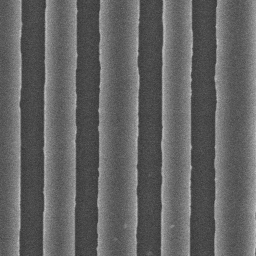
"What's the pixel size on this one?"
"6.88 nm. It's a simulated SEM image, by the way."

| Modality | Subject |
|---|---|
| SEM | lines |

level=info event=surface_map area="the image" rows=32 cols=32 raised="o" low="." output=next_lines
ooo...ooo....oooo...oooo...ooooo
ooo...oooo..ooooo...oooo...ooooo
ooo...ooo...ooooo...oooo...ooooo
ooo...ooo...ooooo...oooo...ooooo
ooo...ooo...ooooo...oooo...ooooo
oo....ooo...ooooo...oooo...ooooo
ooo...oooo..ooooo...oooo...ooooo
ooo...ooo...ooooo...oooo...ooooo
ooo...ooo....oooo...oooo...ooooo
ooo...ooo....oooo...oooo...ooooo
ooo...ooo...ooooo...oooo...ooooo
oo....ooo...ooooo...oooo...ooooo
oo....ooo...ooooo...oooo...ooooo
oo....ooo...ooooo...oooo...ooooo
oo....ooo...ooooo...oooo...ooooo
oo....ooo...ooooo...oooo...ooooo
oo....ooo...ooooo...oooo...ooooo
oo....ooo...ooooo...oooo...ooooo
oo....ooo...ooooo...oooo...ooooo
oo....ooo...ooooo...oooo...ooooo
oo....ooo...ooooo...oooo...ooooo
oo....ooo...ooooo...oooo...ooooo
oo....ooo...ooooo...oooo...ooooo
oo....ooo...ooooo...oooo...ooooo
oo....ooo...ooooo...oooo...ooooo
oo....ooo...ooooo...oooo...ooooo
oo...oooo...ooooo...oooo...ooooo
oo...oooo...ooooo...oooo...ooooo
oo...oooo...ooooo...oooo...ooooo
oo...oooo...ooooo...oooo...ooooo
oo...oooo...ooooo...oooo...ooooo
oo...oooo...ooooo...oooo...ooooo